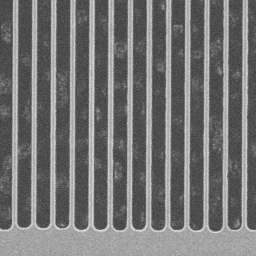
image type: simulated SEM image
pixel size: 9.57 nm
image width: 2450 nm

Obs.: parallel lines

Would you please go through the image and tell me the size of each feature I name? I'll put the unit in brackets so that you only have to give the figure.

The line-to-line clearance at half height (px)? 14.9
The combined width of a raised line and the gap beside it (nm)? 183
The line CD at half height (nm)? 44.2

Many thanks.